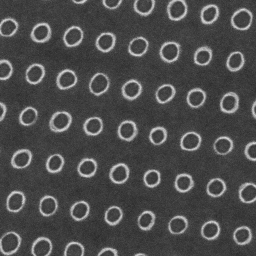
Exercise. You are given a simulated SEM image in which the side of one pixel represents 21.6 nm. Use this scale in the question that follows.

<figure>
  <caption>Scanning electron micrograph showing a regular array of raised bodies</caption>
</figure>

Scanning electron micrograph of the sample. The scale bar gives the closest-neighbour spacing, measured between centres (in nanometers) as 700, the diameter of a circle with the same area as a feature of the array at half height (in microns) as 0.371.